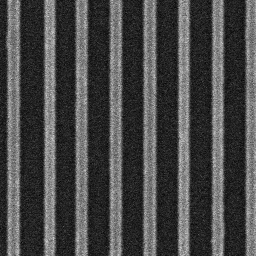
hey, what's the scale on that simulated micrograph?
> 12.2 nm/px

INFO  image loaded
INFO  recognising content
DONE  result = parallel lines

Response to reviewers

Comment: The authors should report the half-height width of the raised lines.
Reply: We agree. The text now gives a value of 118 nanometres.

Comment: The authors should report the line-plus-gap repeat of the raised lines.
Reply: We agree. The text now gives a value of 416 nanometers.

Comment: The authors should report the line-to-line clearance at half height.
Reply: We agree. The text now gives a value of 292 nm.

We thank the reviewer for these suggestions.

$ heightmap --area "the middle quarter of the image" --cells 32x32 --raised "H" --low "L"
LLLHHLLLLLLLHHLLLLLLHHHLLLLLLHHL
LLLHHLLLLLLLHHLLLLLLHHHLLLLLLHHL
LLLHHLLLLLLLHHLLLLLLHHHLLLLLLHHL
LLLHHLLLLLLLHHLLLLLLHHHLLLLLLHHL
LLLHHLLLLLLLHHLLLLLLHHHLLLLLLHHL
LLLHHLLLLLLLHHLLLLLLHHHLLLLLLHHL
LLLHHLLLLLLLHHLLLLLLHHHLLLLLLHHL
LLLHHLLLLLLLHHLLLLLLHHHLLLLLLHHL
LLLHHLLLLLLLHHLLLLLLHHHLLLLLLHHL
LLLHHLLLLLLLHHLLLLLLHHHLLLLLLHHL
LLLHHLLLLLLLHHLLLLLLHHHLLLLLLHHL
LLLHHLLLLLLLHHLLLLLLHHHLLLLLLHHL
LLLHHLLLLLLLHHLLLLLLHHHLLLLLLHHL
LLLHHLLLLLLLHHLLLLLLHHHLLLLLLHHL
LLLHHLLLLLLLHHLLLLLLHHHLLLLLLHHL
LLLHHLLLLLLLHHLLLLLLHHHLLLLLLHHL
LLLHHLLLLLLLHHLLLLLLHHHLLLLLLHHL
LLLHHLLLLLLLHHLLLLLLHHHLLLLLLHHL
LLLHHLLLLLLLHHLLLLLLHHHLLLLLLHHL
LLLHHHLLLLLLHHLLLLLLHHHLLLLLLHHL
LLLHHLLLLLLLHHLLLLLLHHHLLLLLLHHL
LLLHHLLLLLLLHHLLLLLLHHHLLLLLLHHL
LLLHHLLLLLLLHHLLLLLLHHHLLLLLLHHL
LLLHHLLLLLLLHHLLLLLLHHHLLLLLLHHL
LLLHHLLLLLLLHHLLLLLLHHHLLLLLLHHL
LLLHHLLLLLLLHHLLLLLLHHHLLLLLLHHL
LLLHHLLLLLLLHHLLLLLLHHHLLLLLLHHL
LLLHHLLLLLLLHHLLLLLLHHHLLLLLLHHL
LLLHHLLLLLLLHHLLLLLLHHHLLLLLLHHL
LLLHHLLLLLLLHHLLLLLLHHHLLLLLLHHL
LLLHHLLLLLLLHHLLLLLLHHHLLLLLLHHL
LLLHHLLLLLLLHHLLLLLLHHHLLLLLLHHL